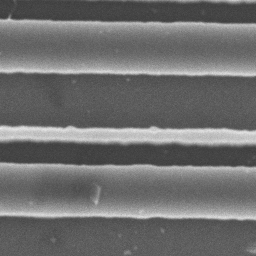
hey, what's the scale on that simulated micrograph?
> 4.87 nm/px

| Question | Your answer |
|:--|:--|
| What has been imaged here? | lines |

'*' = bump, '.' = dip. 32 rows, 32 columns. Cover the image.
................................
................................
**.*............................
********************************
********************************
********************************
********************************
********************************
********************************
................................
................................
................................
................................
................................
................................
................................
*******************************.
.........***********************
................................
................................
**..............................
********************************
********************************
********************************
********************************
********************************
********************************
................................
................................
................................
................................
................................